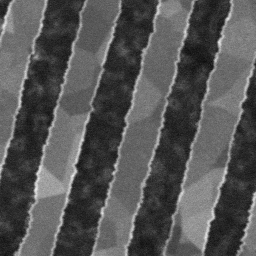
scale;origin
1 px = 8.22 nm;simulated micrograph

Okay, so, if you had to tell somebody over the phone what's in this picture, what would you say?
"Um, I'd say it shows one or a few lines or trenches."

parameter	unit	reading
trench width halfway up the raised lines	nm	303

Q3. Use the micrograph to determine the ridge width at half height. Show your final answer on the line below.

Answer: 285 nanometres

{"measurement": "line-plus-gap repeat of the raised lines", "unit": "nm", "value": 587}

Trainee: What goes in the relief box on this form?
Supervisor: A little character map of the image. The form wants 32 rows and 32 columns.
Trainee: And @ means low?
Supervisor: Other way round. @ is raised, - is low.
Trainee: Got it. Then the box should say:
-@@@@@-----@@@@-----@@@@-----@@@
-@@@@-----@@@@@-----@@@@-----@@@
-@@@@-----@@@@@----@@@@@----@@@@
@@@@@-----@@@@-----@@@@-----@@@@
@@@@@-----@@@@-----@@@@-----@@@@
@@@@-----@@@@@-----@@@@----@@@@@
@@@@-----@@@@-----@@@@-----@@@@@
@@@@-----@@@@-----@@@@-----@@@@@
@@@-----@@@@@-----@@@@-----@@@@@
@@@-----@@@@@----@@@@@----@@@@@-
@@@-----@@@@-----@@@@-----@@@@@-
@@@-----@@@@-----@@@@-----@@@@@-
@@@----@@@@@-----@@@@----@@@@@--
@@-----@@@@-----@@@@@----@@@@@--
@@-----@@@@-----@@@@-----@@@@@--
@@-----@@@@-----@@@@-----@@@@@--
@@----@@@@-----@@@@@-----@@@@---
@-----@@@@-----@@@@@----@@@@@---
@-----@@@@-----@@@@-----@@@@@---
@----@@@@@-----@@@@-----@@@@@---
-----@@@@------@@@@----@@@@@----
-----@@@@-----@@@@@----@@@@@----
-----@@@@-----@@@@-----@@@@@----
-----@@@@-----@@@@-----@@@@-----
----@@@@-----@@@@@-----@@@@-----
----@@@@-----@@@@@----@@@@@-----
----@@@@-----@@@@-----@@@@@----@
----@@@@-----@@@@-----@@@@-----@
----@@@-----@@@@@----@@@@@-----@
---@@@@-----@@@@-----@@@@@-----@
---@@@@-----@@@@-----@@@@@----@@
--@@@@@-----@@@@-----@@@@-----@@